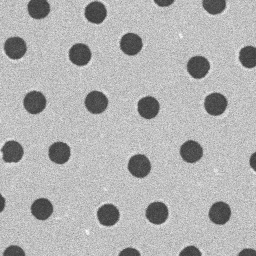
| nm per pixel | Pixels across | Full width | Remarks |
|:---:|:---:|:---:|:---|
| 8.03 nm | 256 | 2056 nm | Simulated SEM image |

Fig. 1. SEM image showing a regular array of holes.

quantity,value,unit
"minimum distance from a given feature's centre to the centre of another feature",395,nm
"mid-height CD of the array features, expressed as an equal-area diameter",181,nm